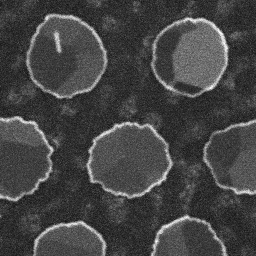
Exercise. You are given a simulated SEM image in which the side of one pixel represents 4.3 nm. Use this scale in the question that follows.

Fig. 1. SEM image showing raised bodies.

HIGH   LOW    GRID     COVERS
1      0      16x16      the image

0000000000000000
0001100000011000
0011110000111100
0011111000111100
0011110000111100
0001110000011000
0000000000000000
1100000000000000
1110001111000111
1110001111100111
1110001111100111
1110001111000011
0000000000000000
0000000000000000
0001110000111000
0011111000111100